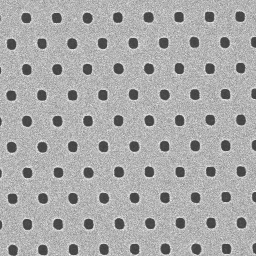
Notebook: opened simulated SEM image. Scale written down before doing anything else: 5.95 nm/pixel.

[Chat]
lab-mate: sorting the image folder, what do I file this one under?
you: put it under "a regular array of holes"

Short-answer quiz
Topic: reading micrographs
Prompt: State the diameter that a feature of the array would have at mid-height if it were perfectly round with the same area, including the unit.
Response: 10.6 px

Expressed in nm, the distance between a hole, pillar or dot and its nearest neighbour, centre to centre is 176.